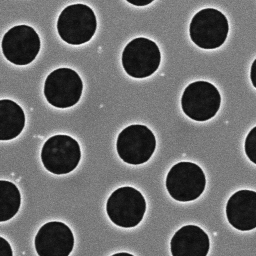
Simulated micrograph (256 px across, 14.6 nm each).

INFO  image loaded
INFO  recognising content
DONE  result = a regular array of holes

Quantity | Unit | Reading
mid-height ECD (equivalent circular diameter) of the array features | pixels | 40.3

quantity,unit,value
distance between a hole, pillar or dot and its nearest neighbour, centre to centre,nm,917